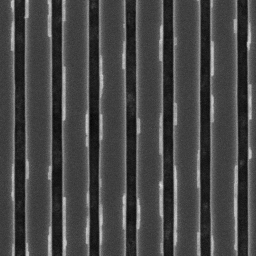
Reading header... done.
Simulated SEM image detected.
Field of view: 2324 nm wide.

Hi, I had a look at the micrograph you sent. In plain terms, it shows parallel lines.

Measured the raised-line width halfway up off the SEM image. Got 243 nanometers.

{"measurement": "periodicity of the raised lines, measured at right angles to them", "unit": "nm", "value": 337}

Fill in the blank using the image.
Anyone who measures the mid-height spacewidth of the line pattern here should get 91.9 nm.